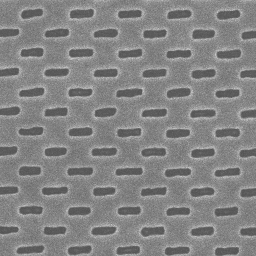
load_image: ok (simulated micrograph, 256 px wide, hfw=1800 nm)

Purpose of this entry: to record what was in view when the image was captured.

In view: a regular array of holes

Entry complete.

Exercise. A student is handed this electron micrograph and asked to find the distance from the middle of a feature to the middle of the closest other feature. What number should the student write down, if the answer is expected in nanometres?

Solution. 217